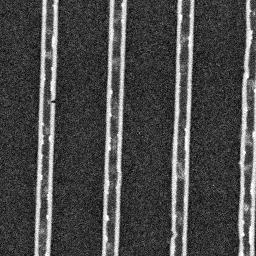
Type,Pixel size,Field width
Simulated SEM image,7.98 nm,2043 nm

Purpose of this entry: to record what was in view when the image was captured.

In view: one or a few lines or trenches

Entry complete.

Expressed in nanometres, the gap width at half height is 442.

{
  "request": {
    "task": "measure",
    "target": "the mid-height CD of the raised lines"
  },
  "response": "0.101 microns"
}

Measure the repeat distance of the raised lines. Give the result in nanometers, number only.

541